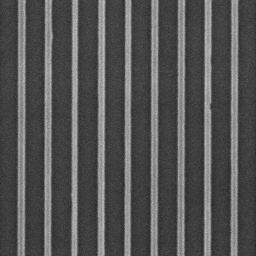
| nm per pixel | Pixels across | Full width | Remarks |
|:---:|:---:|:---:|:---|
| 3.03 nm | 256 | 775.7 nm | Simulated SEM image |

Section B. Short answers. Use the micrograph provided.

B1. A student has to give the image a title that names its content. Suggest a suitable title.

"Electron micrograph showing parallel lines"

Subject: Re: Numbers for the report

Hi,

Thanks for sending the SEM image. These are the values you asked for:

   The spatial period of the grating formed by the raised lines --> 80.6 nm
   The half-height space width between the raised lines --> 0.0625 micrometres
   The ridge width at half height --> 17.1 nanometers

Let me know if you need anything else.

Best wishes